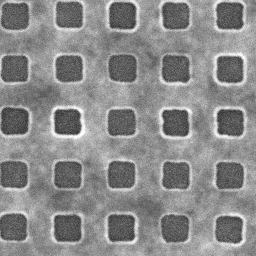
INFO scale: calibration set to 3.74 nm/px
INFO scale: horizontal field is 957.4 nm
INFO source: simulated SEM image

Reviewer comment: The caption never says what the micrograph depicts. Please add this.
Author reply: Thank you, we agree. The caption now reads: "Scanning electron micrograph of a regular array of holes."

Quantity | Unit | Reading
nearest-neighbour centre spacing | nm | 198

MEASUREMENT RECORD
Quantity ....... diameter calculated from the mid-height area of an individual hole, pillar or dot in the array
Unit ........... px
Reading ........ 30.6